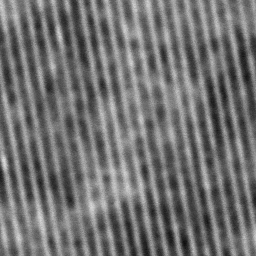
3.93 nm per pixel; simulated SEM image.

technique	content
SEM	parallel lines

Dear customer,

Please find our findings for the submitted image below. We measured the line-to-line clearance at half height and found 41 nanometres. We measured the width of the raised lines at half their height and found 0.0116 microns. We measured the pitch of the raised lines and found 51.3 nanometers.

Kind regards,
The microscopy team